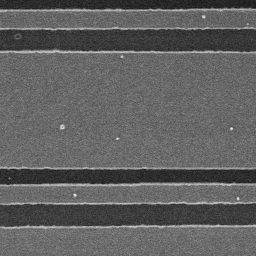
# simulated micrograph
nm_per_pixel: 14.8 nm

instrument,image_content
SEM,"lines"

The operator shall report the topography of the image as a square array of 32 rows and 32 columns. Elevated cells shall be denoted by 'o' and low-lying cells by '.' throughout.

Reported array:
................................
oooooooooooooooooooooooooooooooo
oooooooooooooooooooooooooooooooo
oooooooooooooooooooooooooooooooo
................................
................................
................................
oooooooooooooooooooooooooooooooo
oooooooooooooooooooooooooooooooo
oooooooooooooooooooooooooooooooo
oooooooooooooooooooooooooooooooo
oooooooooooooooooooooooooooooooo
oooooooooooooooooooooooooooooooo
oooooooooooooooooooooooooooooooo
oooooooooooooooooooooooooooooooo
oooooooooooooooooooooooooooooooo
oooooooooooooooooooooooooooooooo
oooooooooooooooooooooooooooooooo
oooooooooooooooooooooooooooooooo
oooooooooooooooooooooooooooooooo
oooooooooooooooooooooooooooooooo
................................
................................
oooooooooooooooooooooooooooooooo
oooooooooooooooooooooooooooooooo
................................
................................
................................
oooooooooooooooooooooooooooooooo
oooooooooooooooooooooooooooooooo
oooooooooooooooooooooooooooooooo
oooooooooooooooooooooooooooooooo